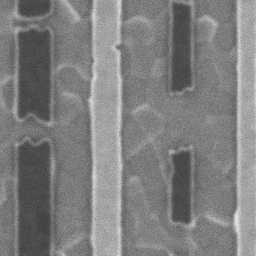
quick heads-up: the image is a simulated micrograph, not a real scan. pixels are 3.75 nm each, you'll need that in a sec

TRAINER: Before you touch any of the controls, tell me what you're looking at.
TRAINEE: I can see one or a few lines or trenches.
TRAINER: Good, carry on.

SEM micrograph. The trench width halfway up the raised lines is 167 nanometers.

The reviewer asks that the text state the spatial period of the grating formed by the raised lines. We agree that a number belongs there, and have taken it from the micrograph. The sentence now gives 273 nanometers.